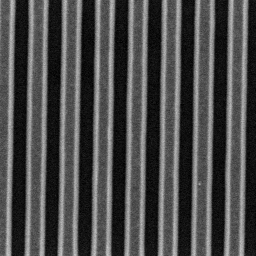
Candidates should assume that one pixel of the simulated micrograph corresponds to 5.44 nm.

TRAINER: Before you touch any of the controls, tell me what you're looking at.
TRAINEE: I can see groups of lines, slits or small figures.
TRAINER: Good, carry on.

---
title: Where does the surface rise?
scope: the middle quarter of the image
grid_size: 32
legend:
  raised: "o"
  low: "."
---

oooo....oooo....oooo.....oooo...
oooo....oooo....oooo.....oooo...
oooo....oooo....oooo.....oooo...
oooo....oooo....oooo.....oooo...
oooo....oooo....oooo.....ooo....
ooo.....oooo....oooo.....ooo....
ooo.....oooo....oooo.....ooo....
ooo.....oooo....oooo.....ooo....
ooo.....oooo....oooo.....ooo....
ooo.....oooo....oooo.....ooo....
ooo.....oooo....oooo.....ooo....
ooo.....oooo....oooo.....ooo....
ooo.....oooo....oooo.....ooo....
ooo.....oooo....oooo.....ooo....
ooo.....oooo....oooo.....ooo....
ooo.....oooo....oooo.....ooo....
ooo.....oooo....oooo.....ooo....
ooo.....oooo....oooo.....ooo....
ooo.....oooo....oooo.....ooo....
ooo.....oooo....oooo....oooo....
ooo.....oooo....oooo....oooo....
ooo.....oooo....oooo....oooo....
ooo.....oooo....oooo....oooo....
ooo.....ooo.....oooo....oooo....
ooo.....ooo.....oooo....oooo....
ooo.....ooo.....oooo....oooo....
ooo.....ooo.....oooo....oooo....
ooo.....ooo.....oooo....oooo....
ooo.....ooo.....oooo....oooo....
ooo.....ooo.....oooo....oooo....
ooo.....ooo.....oooo....oooo....
ooo.....ooo.....oooo....oooo....